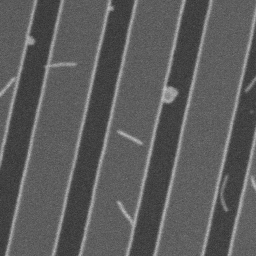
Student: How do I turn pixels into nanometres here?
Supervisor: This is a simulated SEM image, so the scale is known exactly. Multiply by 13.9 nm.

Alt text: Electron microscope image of lines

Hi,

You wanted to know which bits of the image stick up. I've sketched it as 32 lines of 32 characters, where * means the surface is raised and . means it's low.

*****...******...******...******
****...*******...******...******
****...******...*******...******
****...******...******...*******
****...******...******...******.
***...*******...******...******.
***...******....******...******.
***...******...*******...******.
***...******...******...*******.
**....******...******...******..
**...*******...******...******..
**...******...*******...******..
**...******...******....******..
**...******...******...*******..
*....******...******...******...
*...******....******...******...
*...******...******....******...
*...******...******...*******...
....******...******...******...*
...*******...******...******...*
...******...*******...******...*
...******...******....******...*
...******...******...*******...*
...******...******...******...**
..******....******...******...**
..******...******....******...**
..******...******...*******...**
..******...******...******...***
.*******...******...******...***
.******....******...******...***
.******...******....******...***
.******...******...*******...***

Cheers